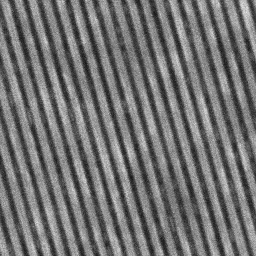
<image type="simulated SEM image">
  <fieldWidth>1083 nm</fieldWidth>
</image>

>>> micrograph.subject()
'parallel lines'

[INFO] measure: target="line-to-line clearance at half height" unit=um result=0.03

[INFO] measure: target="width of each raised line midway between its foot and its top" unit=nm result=30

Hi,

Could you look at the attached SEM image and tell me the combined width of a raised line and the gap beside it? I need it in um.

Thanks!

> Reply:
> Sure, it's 0.0572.